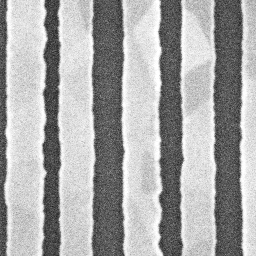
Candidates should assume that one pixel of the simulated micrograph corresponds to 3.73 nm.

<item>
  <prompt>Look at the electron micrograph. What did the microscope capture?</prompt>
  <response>lines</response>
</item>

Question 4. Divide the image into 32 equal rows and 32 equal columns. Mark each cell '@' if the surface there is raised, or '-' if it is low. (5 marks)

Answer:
-@@@@---@@@----@@@@@---@@@@---@@
-@@@@@-@@@@@----@@@@---@@@@---@@
-@@@@--@@@@-----@@@@---@@@@---@@
-@@@@@-@@@@-----@@@@---@@@@---@@
-@@@@@-@@@@-----@@@@---@@@@---@@
-@@@@@--@@@-----@@@@---@@@@---@@
-@@@@---@@@@----@@@@---@@@@---@@
-@@@@---@@@-----@@@@---@@@@---@@
-@@@@@-@@@@-----@@@@---@@@@---@@
-@@@@@-@@@@----@@@@@---@@@@---@@
-@@@@--@@@@----@@@@@---@@@@---@@
-@@@@--@@@@----@@@@@---@@@@---@@
-@@@@--@@@@----@@@@@---@@@@---@@
-@@@@--@@@@----@@@@@---@@@@---@@
-@@@@@-@@@@----@@@@@---@@@@---@@
-@@@@--@@@@----@@@@@---@@@@---@@
-@@@@--@@@@@---@@@@@---@@@@---@@
-@@@@--@@@@@----@@@@---@@@@---@@
-@@@@---@@@@----@@@@---@@@@---@@
-@@@@---@@@@----@@@@---@@@@---@@
-@@@@---@@@@----@@@@---@@@@---@@
-@@@@@-@@@@@----@@@@---@@@@---@@
-@@@@---@@@@----@@@@---@@@@---@@
-@@@@--@@@@-----@@@@---@@@@---@@
-@@@@---@@@@----@@@@---@@@@---@@
-@@@@---@@@-----@@@@---@@@@---@@
-@@@@---@@@-----@@@@---@@@@---@@
-@@@@--@@@@-----@@@@---@@@@---@@
-@@@@---@@@-----@@@@---@@@@---@@
-@@@@---@@@-----@@@@---@@@@---@@
-@@@@---@@@-----@@@@---@@@@---@@
-@@@@---@@@-----@@@@---@@@@----@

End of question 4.